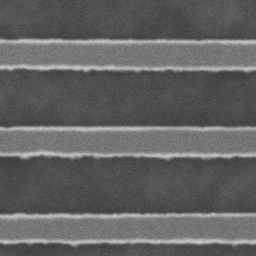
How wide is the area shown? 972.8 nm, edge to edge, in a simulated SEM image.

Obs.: lines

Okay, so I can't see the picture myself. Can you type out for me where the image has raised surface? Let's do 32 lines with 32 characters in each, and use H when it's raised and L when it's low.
LLLLLLLLLLLLLLLLLLLLLLLLLLLLLLLL
LLLLLLLLLLLLLLLLLLLLLLLLLLLLLLLL
LLLLLLLLLLLLLLLLLLLLLLLLLLLLLLLL
LLLLLLLLLLLLLLLLLLLLLLLLLLLLLLLL
LLLLLLLLLLLLLLLLLLLLLLLLLLLLLLLL
HHHHHHHHHHHHHHHHHHHHHHHHHHHHHHHH
HHHHHHHHHHHHHHHHHHHHHHHHHHHHHHHH
HHHHHHHHHHHHHHHHHHHHHHHHHHHHHHHH
HHLLHHHLHHHHHHHHHHHHHHHHHHHHHHHH
LLLLLLLLLLLLLLLLLLLLLLLLLLLLLLLL
LLLLLLLLLLLLLLLLLLLLLLLLLLLLLLLL
LLLLLLLLLLLLLLLLLLLLLLLLLLLLLLLL
LLLLLLLLLLLLLLLLLLLLLLLLLLLLLLLL
LLLLLLLLLLLLLLLLLLLLLLLLLLLLLLLL
LLLLLLLLLLLLLLLLLLLLLLLLLLLLLLLL
LLLLLLLLLLLLLLLLLLLLLLLLLLLLLLLL
HHHHHHHHHHHHHHHHHHHHHHHHHHHHHHHH
HHHHHHHHHHHHHHHHHHHHHHHHHHHHHHHH
HHHHHHHHHHHHHHHHHHHHHHHHHHHHHHHH
LLLLLLLLHLLLHHLLLHHHHHHHHHHHHHHL
LLLLLLLLLLLLLLLLLLLLLLLLLLLLLLLL
LLLLLLLLLLLLLLLLLLLLLLLLLLLLLLLL
LLLLLLLLLLLLLLLLLLLLLLLLLLLLLLLL
LLLLLLLLLLLLLLLLLLLLLLLLLLLLLLLL
LLLLLLLLLLLLLLLLLLLLLLLLLLLLLLLL
LLLLLLLLLLLLLLLLLLLLLLLLLLLLLLLL
LLLLLLLLLLLLLLLLLLLLLLLLLLLLLLLL
HHHHHHHHHHHHHHHHHHHHHHHHHHHHHHHH
HHHHHHHHHHHHHHHHHHHHHHHHHHHHHHHH
HHHHHHHHHHHHHHHHHHHHHHHHHHHHHHHH
LLLLLLLLLLLLLLLLLLLLLLLLLLLLLLLL
LLLLLLLLLLLLLLLLLLLLLLLLLLLLLLLL